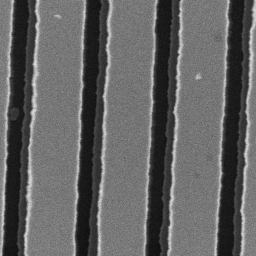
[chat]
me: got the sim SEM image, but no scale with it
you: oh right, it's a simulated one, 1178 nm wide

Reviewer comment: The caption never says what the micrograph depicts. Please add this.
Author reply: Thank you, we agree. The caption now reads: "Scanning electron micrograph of lines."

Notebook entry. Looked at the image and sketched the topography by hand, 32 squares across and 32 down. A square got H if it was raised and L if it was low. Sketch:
HHLLHHHHHHHLLLHHHHHHLLHHHHHHHLLL
HHLLHHHHHHHLLLHHHHHLLLHHHHHHHLLL
HHLLLHHHHHHLLHHHHHHLLLHHHHHHHLLL
HLLLHHHHHHHLLHHHHHHLLLHHHHHHHLLH
HLLLHHHHHHLLLHHHHHHLLLHHHHHHLLLH
HLLLHHHHHHLLLHHHHHHLLLHHHHHHLLLH
HLLLHHHHHHLLLHHHHHHLLLHHHHHHLLLH
HLLLHHHHHHLLLHHHHHHLLLHHHHHHLLLH
HLLLHHHHHHLLLHHHHHHLLLHHHHHHLLLH
HLLLHHHHHHLLLHHHHHHLLLHHHHHHLLLH
HLLLHHHHHHLLLHHHHHHLLLHHHHHHLLLH
HLLLHHHHHHLLLHHHHHHLLLHHHHHHLLLH
HLLLHHHHHHLLLHHHHHHLLLHHHHHHLLLH
HLLLHHHHHHLLLHHHHHHLLLHHHHHHLLLH
HLLLHHHHHHLLLHHHHHHLLLHHHHHHLLLH
HLLLHHHHHHLLLHHHHHHLLLHHHHHHLLLH
HLLLHHHHHHLLLHHHHHHLLLHHHHHHLLLH
HLLLHHHHHHLLLHHHHHHLLLHHHHHHLLLH
HLLLHHHHHHLLLHHHHHHLLLHHHHHHLLLH
HLLLHHHHHHLLLHHHHHHLLLHHHHHHLLHH
HLLLHHHHHHLLLHHHHHHLLHHHHHHHLLLH
HLLHHHHHHHLLLHHHHHHLLHHHHHHHLLHH
HLLHHHHHHHLLLHHHHHHLLLHHHHHHLLHH
HLLHHHHHHHLLHHHHHHLLLHHHHHHHLLHH
HLLHHHHHHHLLHHHHHHLLLHHHHHHLLLHH
HLLHHHHHHHLLHHHHHHLLLHHHHHHLLLHH
HLLHHHHHHHLLHHHHHHLLLHHHHHHLLLHH
LLLHHHHHHLLLHHHHHHLLLHHHHHHLLLHH
LLLHHHHHHLLLHHHHHHLLLHHHHHHLLLHH
LLLHHHHHHLLLHHHHHHLLLHHHHHHLLLHH
LLLHHHHHHLLLHHHHHHLLLHHHHHHLLLHH
LLLHHHHHHLLLHHHHHHLLLHHHHHHLLLHH